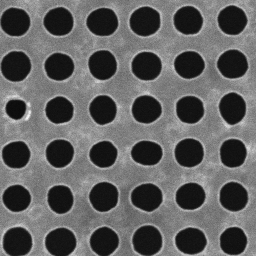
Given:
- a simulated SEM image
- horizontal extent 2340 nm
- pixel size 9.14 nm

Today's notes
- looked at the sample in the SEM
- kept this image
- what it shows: a regular array of holes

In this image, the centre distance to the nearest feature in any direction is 392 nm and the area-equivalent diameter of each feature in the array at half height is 28.9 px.